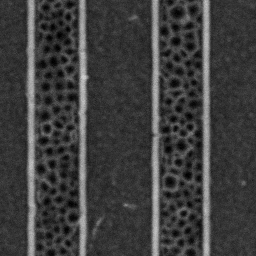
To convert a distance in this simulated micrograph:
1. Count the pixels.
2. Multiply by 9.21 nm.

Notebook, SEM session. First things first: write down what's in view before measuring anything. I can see one or a few lines or trenches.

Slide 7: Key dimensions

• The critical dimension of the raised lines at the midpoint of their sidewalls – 0.467 µm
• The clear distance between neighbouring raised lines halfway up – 0.673 um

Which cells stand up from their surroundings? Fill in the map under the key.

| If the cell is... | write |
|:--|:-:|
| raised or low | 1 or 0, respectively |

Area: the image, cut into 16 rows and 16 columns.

0011100000111000
0011100000111000
0011100000111000
0011100000111000
0011100000111000
0011100000111000
0011100000111000
0011100000111000
0011100000111000
0011100000111000
0011100000111000
0011100000111000
0011100000111000
0011100000111000
0011100000111000
0011100000111000